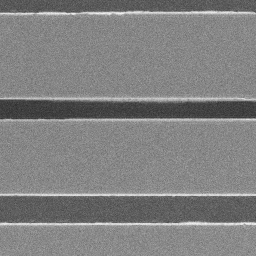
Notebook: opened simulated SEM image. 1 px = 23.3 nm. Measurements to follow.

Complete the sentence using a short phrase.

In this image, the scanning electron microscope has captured lines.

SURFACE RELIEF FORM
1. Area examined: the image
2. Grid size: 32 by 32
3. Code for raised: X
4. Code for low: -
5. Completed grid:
--------------------------------
--------------------------------
XXXXXXXXXXXXXXXXXXXXXXXXXXXXXXXX
XXXXXXXXXXXXXXXXXXXXXXXXXXXXXXXX
XXXXXXXXXXXXXXXXXXXXXXXXXXXXXXXX
XXXXXXXXXXXXXXXXXXXXXXXXXXXXXXXX
XXXXXXXXXXXXXXXXXXXXXXXXXXXXXXXX
XXXXXXXXXXXXXXXXXXXXXXXXXXXXXXXX
XXXXXXXXXXXXXXXXXXXXXXXXXXXXXXXX
XXXXXXXXXXXXXXXXXXXXXXXXXXXXXXXX
XXXXXXXXXXXXXXXXXXXXXXXXXXXXXXXX
XXXXXXXXXXXXXXXXXXXXXXXXXXXXXXXX
--------------------------------
--------------------------------
--------------------------------
XXXXXXXXXXXXXXXXXXXXXXXXXXXXXXXX
XXXXXXXXXXXXXXXXXXXXXXXXXXXXXXXX
XXXXXXXXXXXXXXXXXXXXXXXXXXXXXXXX
XXXXXXXXXXXXXXXXXXXXXXXXXXXXXXXX
XXXXXXXXXXXXXXXXXXXXXXXXXXXXXXXX
XXXXXXXXXXXXXXXXXXXXXXXXXXXXXXXX
XXXXXXXXXXXXXXXXXXXXXXXXXXXXXXXX
XXXXXXXXXXXXXXXXXXXXXXXXXXXXXXXX
XXXXXXXXXXXXXXXXXXXXXXXXXXXXXXXX
--------------------------------
--------------------------------
--------------------------------
--------------------------------
XXXXXXXXXXXXXXXXXXXXXXXXXXXXXXXX
XXXXXXXXXXXXXXXXXXXXXXXXXXXXXXXX
XXXXXXXXXXXXXXXXXXXXXXXXXXXXXXXX
XXXXXXXXXXXXXXXXXXXXXXXXXXXXXXXX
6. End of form